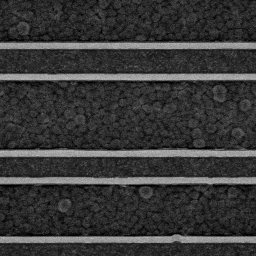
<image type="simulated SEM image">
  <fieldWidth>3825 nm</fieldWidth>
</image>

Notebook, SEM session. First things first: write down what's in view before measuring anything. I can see one or a few lines or trenches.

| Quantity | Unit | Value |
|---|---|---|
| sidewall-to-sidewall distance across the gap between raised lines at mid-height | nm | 990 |